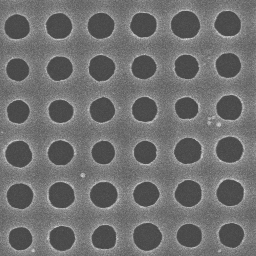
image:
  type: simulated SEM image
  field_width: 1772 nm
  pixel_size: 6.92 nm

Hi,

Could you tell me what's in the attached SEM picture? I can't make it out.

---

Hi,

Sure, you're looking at a regular array of holes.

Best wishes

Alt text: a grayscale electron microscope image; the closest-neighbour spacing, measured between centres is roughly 290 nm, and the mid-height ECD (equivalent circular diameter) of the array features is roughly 0.175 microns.